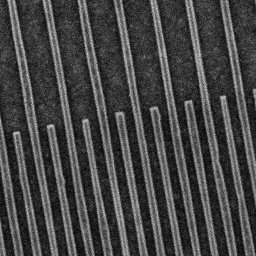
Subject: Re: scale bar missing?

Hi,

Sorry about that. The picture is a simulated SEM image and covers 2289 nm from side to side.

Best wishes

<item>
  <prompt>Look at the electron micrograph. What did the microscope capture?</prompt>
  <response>parallel lines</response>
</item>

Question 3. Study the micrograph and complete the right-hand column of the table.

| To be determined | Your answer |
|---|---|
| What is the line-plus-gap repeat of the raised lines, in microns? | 0.156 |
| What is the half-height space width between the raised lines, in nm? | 106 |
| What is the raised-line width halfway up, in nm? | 52.8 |